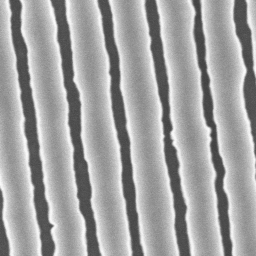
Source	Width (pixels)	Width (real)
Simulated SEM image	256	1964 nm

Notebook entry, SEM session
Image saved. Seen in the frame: parallel lines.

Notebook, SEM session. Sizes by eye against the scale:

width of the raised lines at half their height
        249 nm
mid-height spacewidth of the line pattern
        0.0922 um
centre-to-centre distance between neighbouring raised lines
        0.343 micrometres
